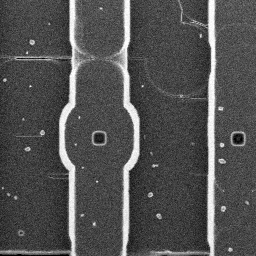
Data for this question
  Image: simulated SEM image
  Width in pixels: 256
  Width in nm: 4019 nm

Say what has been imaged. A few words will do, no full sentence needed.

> wiring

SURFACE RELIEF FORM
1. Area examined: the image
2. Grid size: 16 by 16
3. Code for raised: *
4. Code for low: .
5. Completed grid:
.....***.....***
.....***.....***
.....***.....***
.....***.....***
.....***.....***
.....***.....***
....****.....***
....****.....***
....*****....***
....****.....***
....****.....***
.....***.....***
.....***.....***
.....***.....***
.....***.....***
.....***.....***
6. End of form